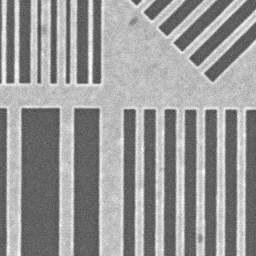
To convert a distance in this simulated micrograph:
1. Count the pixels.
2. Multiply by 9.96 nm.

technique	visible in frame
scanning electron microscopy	groups of lines, slits or small figures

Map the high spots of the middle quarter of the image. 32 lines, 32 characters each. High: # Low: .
..#.......######################
..#.......######################
..#.......######################
..#.......######################
..#.......######################
################################
################################
################################
################################
################################
################################
##.......######...##...##...##..
##.......######...##...##...##..
##.......######...##...##...##..
##.......######...##...##...##..
##.......######...##...##...##..
##.......######...##...##...##..
##.......######...##...##...##..
##.......######...##...##...##..
##.......######...##...##...##..
##.......######...##...##...##..
##.......######...##...##...##..
##.......######...##...##...##..
##.......######...##...##...##..
##.......######...##...##...##..
##.......######...##...##...##..
##.......######...##...##...##..
##.......######...##...##...##..
##.......######...##...##...##..
##.......######...##...##...##..
##.......######...##...##...##..
##.......######...##...##...##..